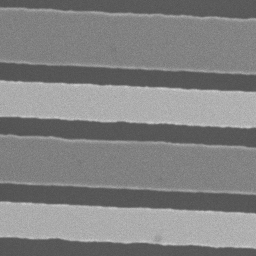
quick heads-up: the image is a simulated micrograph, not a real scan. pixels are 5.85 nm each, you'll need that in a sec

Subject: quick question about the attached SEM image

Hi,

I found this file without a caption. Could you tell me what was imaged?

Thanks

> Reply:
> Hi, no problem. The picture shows lines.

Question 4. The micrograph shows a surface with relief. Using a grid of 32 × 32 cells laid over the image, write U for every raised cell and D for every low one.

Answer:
DDDDDDDDDDDDDDDDDDDDDDDDDDDDDDDD
UUUUUUUUUUUUUDDDDDDDDDDDDDDDDDDD
UUUUUUUUUUUUUUUUUUUUUUUUUUUUUUUU
UUUUUUUUUUUUUUUUUUUUUUUUUUUUUUUU
UUUUUUUUUUUUUUUUUUUUUUUUUUUUUUUU
UUUUUUUUUUUUUUUUUUUUUUUUUUUUUUUU
UUUUUUUUUUUUUUUUUUUUUUUUUUUUUUUU
UUUUUUUUUUUUUUUUUUUUUUUUUUUUUUUU
DDDDDDDDDDDDDDDUUUUUUUUUUUUUUUUU
DDDDDDDDDDDDDDDDDDDDDDDDDDDDDDDD
UUUUUUUUUDDDDDDDDDDDDDDDDDDDDDDD
UUUUUUUUUUUUUUUUUUUUUUUUUUUUUUUD
UUUUUUUUUUUUUUUUUUUUUUUUUUUUUUUU
UUUUUUUUUUUUUUUUUUUUUUUUUUUUUUUU
UUUUUUUUUUUUUUUUUUUUUUUUUUUUUUUU
DDDDDDDDDDDDDDDDDDDDDUUUUUUUUUUU
DDDDDDDDDDDDDDDDDDDDDDDDDDDDDDDD
UUUUUUUUUUUDDDDDDDDDDDDDDDDDDDDD
UUUUUUUUUUUUUUUUUUUUUUUUUUUUUUUD
UUUUUUUUUUUUUUUUUUUUUUUUUUUUUUUU
UUUUUUUUUUUUUUUUUUUUUUUUUUUUUUUU
UUUUUUUUUUUUUUUUUUUUUUUUUUUUUUUU
UUUUUUUUUUUUUUUUUUUUUUUUUUUUUUUU
DDDDDDDDDDDDDUUUUUUUUUUUUUUUUUUU
DDDDDDDDDDDDDDDDDDDDDDDDDDDDDDDD
UUUUDDDDDDDDDDDDDDDDDDDDDDDDDDDD
UUUUUUUUUUUUUUUUUUUUUUUUUUUDDDDD
UUUUUUUUUUUUUUUUUUUUUUUUUUUUUUUU
UUUUUUUUUUUUUUUUUUUUUUUUUUUUUUUU
UUUUUUUUUUUUUUUUUUUUUUUUUUUUUUUU
DDDDDDDDDDDDDDDDDDDDUUUUUUUUUUUU
DDDDDDDDDDDDDDDDDDDDDDDDDDDDDDDD